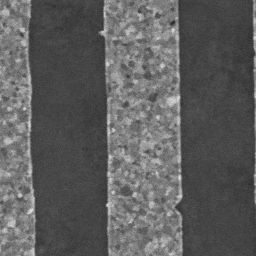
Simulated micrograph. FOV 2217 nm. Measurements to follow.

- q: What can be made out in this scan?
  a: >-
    one or a few lines or trenches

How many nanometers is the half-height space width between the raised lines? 671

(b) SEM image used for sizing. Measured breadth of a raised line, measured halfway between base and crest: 617 nm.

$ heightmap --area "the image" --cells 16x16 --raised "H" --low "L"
HHLLLLLHHHHLLLLL
HHLLLLLHHHHLLLLL
HHLLLLLHHHHLLLLL
HHLLLLLHHHHLLLLL
HHLLLLLHHHHLLLLL
HHLLLLLHHHHLLLLL
HHLLLLLHHHHLLLLL
HHLLLLLHHHHLLLLL
HHLLLLLHHHHLLLLL
HHLLLLLHHHHLLLLL
HHLLLLLHHHHLLLLL
HHLLLLLHHHHLLLLL
HHLLLLLHHHHLLLLL
HHLLLLLHHHHLLLLL
HHLLLLLHHHHLLLLL
HHLLLLLHHHHLLLLL